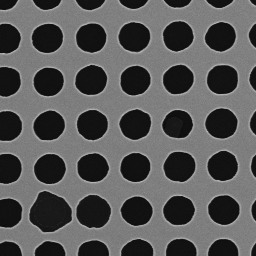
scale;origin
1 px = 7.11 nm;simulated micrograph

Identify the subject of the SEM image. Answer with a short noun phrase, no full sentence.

a regular array of holes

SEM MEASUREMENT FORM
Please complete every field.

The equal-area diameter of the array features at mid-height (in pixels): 30.1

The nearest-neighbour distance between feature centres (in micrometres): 0.303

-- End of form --